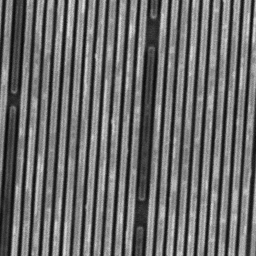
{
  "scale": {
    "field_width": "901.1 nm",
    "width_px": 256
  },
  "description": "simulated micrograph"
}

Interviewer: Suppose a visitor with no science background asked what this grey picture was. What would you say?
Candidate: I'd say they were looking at parallel lines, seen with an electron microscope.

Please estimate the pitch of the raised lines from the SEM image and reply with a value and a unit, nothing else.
0.0364 µm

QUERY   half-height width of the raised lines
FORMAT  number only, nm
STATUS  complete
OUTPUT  19.3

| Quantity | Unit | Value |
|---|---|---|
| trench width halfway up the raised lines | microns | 0.0162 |